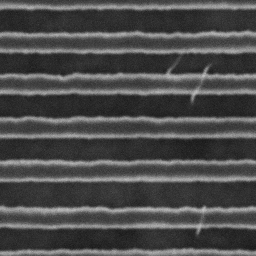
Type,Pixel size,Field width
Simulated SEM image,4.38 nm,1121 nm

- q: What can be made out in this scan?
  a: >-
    lines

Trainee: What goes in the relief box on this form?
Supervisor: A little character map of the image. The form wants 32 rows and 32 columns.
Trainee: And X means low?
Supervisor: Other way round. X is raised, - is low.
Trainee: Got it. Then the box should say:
XXXXXXXXXXXXXXXXXXXXXXXXXXXXXXXX
--------------------------------
--------------------------------
--------------------------------
XXXXXXXXXXXXXXXXXXXXXXXXXXXXXXXX
XXXXXXXXXXXXXXXXXXXXXXXXXXXXXXXX
XXXXXXXXXXXXXXXXXXXXXXXXXXXXXX--
--------------------------------
--------------------------------
XXXXXXX--XXXXXXXXXXXXXXXXXXXXXXX
XXXXXXXXXXXXXXXXXXXXXXXXXXXXXXXX
XXXXXXXXXXXXXXXXXXXXXXXXXXXXXXXX
--------------------------------
--------------------------------
--------------------------------
XXXXXXXXXXXXXXXXXXXXXXXXXXXXXXXX
XXXXXXXXXXXXXXXXXXXXXXXXXXXXXXXX
--------------------------------
--------------------------------
--------------------------------
XXXXXXXXXXXXXXXXXXXXXXXXXXXXXXXX
XXXXXXXXXXXXXXXXXXXXXXXXXXXXXXXX
XXXXXXXXXXXXXXXXXXXXXXXXXXXXXXXX
--------------------------------
--------------------------------
--------------------------------
XXXXXXXXXXXXXXXXXXXXXXXXXXXXXXXX
XXXXXXXXXXXXXXXXXXXXXXXXXXXXXXXX
------X-------------------------
--------------------------------
--------------------------------
XXXXXXXXXXXXXXXXXXXXXXXXXXXXXXXX